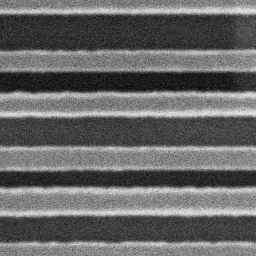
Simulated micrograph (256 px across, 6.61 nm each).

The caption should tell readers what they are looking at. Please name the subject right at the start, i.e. lines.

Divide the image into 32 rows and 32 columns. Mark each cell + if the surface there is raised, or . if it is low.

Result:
++++++++++++++++++++++++++++++++
++++++++++++++++++++++++++++++++
................................
................................
................................
................................
+.++++++.++.++++++++++++++++++++
++++++++++++++++++++++++++++++++
++++++++++++++++++++++++++++++++
................................
................................
................................
++++++++++++++++++++++++++++++++
++++++++++++++++++++++++++++++++
+++.+...++......+.....+.........
................................
................................
................................
++++++++++++++++++++++++++++++++
++++++++++++++++++++++++++++++++
++++++++++++++++++++++++++++++++
................................
................................
..+++.++++++..+..+++++.+..+....+
++++++++++++++++++++++++++++++++
++++++++++++++++++++++++++++++++
++++++++++++++++++++++++++++++++
................................
................................
................................
..+++.++.++++..++++++.++++++++++
++++++++++++++++++++++++++++++++